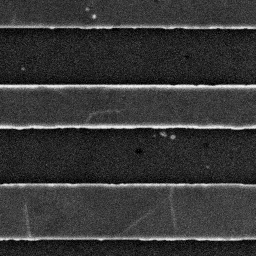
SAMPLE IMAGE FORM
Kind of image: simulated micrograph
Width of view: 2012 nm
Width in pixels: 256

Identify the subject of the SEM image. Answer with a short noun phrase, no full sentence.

lines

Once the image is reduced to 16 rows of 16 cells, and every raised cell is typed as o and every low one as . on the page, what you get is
oooooooooooooooo
oooooooooooooooo
................
................
................
oooooooooooooooo
oooooooooooooooo
oooooooooooooooo
................
................
................
................
oooooooooooooooo
oooooooooooooooo
oooooooooooooooo
................